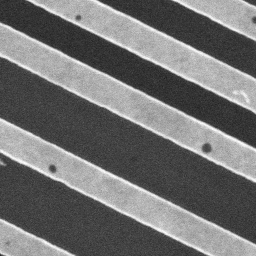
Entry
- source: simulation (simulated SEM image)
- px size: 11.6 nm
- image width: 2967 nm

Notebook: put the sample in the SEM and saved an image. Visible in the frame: lines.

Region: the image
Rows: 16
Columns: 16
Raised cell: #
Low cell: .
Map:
...####.....####
.....####.....##
##.....####.....
####.....####...
..####.....####.
....####.....###
......####.....#
........####....
##........####..
####........####
..####........##
....####........
......####......
........####....
##........####..
####........####